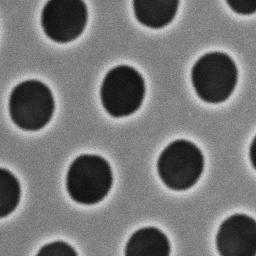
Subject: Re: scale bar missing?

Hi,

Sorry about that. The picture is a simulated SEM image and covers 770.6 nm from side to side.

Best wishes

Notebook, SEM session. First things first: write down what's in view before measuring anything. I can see holes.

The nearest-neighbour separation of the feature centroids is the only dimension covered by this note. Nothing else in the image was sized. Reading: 92.6 pixels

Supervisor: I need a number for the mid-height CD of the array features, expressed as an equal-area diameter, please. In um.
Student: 0.147